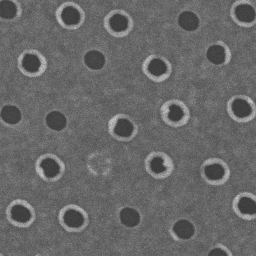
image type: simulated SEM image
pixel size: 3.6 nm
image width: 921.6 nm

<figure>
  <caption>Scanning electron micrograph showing a regular array of holes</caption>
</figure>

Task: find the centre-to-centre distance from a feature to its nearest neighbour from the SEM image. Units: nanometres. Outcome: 178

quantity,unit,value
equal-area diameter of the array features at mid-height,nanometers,68.8